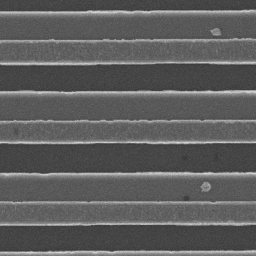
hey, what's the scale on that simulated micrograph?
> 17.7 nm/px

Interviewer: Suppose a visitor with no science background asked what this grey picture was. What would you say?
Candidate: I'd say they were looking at lines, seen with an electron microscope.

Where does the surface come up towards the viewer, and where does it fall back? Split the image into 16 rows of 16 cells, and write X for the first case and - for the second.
----------------
XXXXXXXXXXXXXXXX
XXXXXXXXXXXXXXXX
XXXXXXXXXXXXXXXX
----------------
----------------
XXXXXXXXXXXXXXXX
XXXXXXXXXXXXXXXX
XXXXXXXXXXXXXXXX
----------------
----------------
XXXXXXXXXXXXXXXX
XXXXXXXXXXXXXXXX
XXXXXXXXXXXXXXXX
----------------
----------------